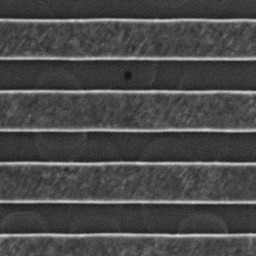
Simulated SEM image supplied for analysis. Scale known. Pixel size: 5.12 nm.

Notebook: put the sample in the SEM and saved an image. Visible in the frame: wiring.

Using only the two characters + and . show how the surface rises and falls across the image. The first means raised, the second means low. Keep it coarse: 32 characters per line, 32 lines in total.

................................
................................
............+++.................
++++++++++++++++++++++++++++++++
++++++++++++++++++++++++++++++++
++++++++++++++++++++++++++++++++
++++++++++++++++++++++++++++++++
................................
................................
................................
................................
.++++++++.++++++..+++...........
++++++++++++++++++++++++++++++++
++++++++++++++++++++++++++++++++
++++++++++++++++++++++++++++++++
++++++++++++++++++++++++++++++++
................................
................................
................................
................................
.++++........+++++..+++.........
++++++++++++++++++++++++++++++++
++++++++++++++++++++++++++++++++
++++++++++++++++++++++++++++++++
++++++++++++++++++++++++++++++++
................................
................................
................................
................................
++++++++++++++++++++++++++++++++
++++++++++++++++++++++++++++++++
++++++++++++++++++++++++++++++++